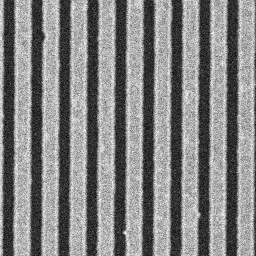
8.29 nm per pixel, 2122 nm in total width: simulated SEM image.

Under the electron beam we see parallel lines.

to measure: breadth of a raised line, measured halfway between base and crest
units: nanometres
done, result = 123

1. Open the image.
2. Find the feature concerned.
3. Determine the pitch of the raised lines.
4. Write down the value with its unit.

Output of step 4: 231 nanometres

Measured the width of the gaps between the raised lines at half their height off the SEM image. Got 108 nm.